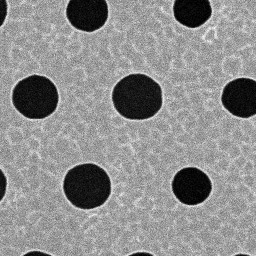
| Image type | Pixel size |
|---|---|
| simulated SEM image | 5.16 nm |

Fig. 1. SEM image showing holes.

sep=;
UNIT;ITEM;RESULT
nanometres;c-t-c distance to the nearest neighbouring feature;529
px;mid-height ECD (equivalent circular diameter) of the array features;46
